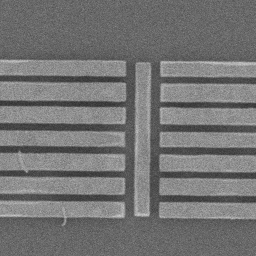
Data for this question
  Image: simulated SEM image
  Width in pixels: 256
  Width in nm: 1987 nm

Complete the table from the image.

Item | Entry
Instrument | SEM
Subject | groups of lines, slits or small figures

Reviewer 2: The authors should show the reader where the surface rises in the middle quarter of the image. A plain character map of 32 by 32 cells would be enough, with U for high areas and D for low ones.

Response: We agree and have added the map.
UUUUUUUUUUUUUUUDDDUUUUDDUUUUUUUU
UUUUUUUUUUUUUUUDDDUUUUDDUUUUUUUU
UUUUUUUUUUUUUUUDDDUUUDDDUUUUUUUU
DDDDDDDDDDDDDDDDDDUUUDDDDDDDDDDD
DDDDDDDDDDDDDDDDDDUUUDDDDDDDDDDD
UUUUUUUUUUUUUUUDDDUUUDDDDUUUUUUU
UUUUUUUUUUUUUUUDDDUUUDDDDUUUUUUU
UUUUUUUUUUUUUUUDDDUUUDDDDUUUUUUU
UUUUUUUUUUUUUUUDDDUUUDDDUUUUUUUU
DDDDDDDDDDDDDDDDDDUUUDDDDDDDDDDD
DDDDDDDDDDDDDDDDDDUUUDDDDDDDDDDD
UUUUUUUUUUUUUUUDDDUUUDDDUUUUUUUU
UUUUUUUUUUUUUUUDDDUUUDDDUUUUUUUU
UUUUUUUUUUUUUUUDDDUUUDDDUUUUUUUU
UUUUUUUUUUUUUUUDDDUUUDDDUUUUUUUU
DDDDDDDDDDDDDDDDDDUUUDDDDDDDDDDD
DDDDDDDDDDDDDDDDDDUUUDDDDDDDDDDD
UUUUUUUUUUUUUUDDDDUUUDDDUUUUUUUU
UUUUUUUUUUUUUUUDDDUUUDDDUUUUUUUU
UUUUUUUUUUUUUUUDDDUUUDDDUUUUUUUU
DDDDDDDDDDDDDDDDDDUUUDDDDDDDDDDD
DDDDDDDDDDDDDDDDDDUUUDDDDDDDDDDD
UUUUDDDDDDDDDDDDDDUUUDDDDDDDDDDD
UUUUUUUUUUUUUUUDDDUUUDDDUUUUUUUU
UUUUUUUUUUUUUUUDDDUUUDDDUUUUUUUU
UUUUUUUUUUUUUUUDDDUUUDDDUUUUUUUU
DUUUUUUUUUDDDDDDDDUUUDDDUUUUUDDU
DDDDDDDDDDDDDDDDDDUUUDDDDDDDDDDD
UUUUUUUUUUDDDDDDDDUUUDDDDDDDDDDD
UUUUUUUUUUUUUUUDDDUUUDDDUUUUUUUU
UUUUUUUUUUUUUUUDDDUUUDDDUUUUUUUU
UUUUUUUUUUUUUUUDDDUUUDDDUUUUUUUU